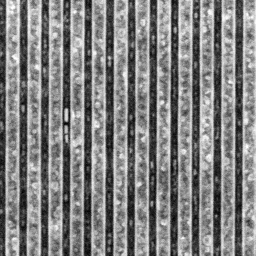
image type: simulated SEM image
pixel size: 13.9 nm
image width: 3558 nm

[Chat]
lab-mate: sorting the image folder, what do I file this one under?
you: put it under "parallel lines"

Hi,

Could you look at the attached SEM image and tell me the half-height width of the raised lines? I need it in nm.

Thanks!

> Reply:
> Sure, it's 177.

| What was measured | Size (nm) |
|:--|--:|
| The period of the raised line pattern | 300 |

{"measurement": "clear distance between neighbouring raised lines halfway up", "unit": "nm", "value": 118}